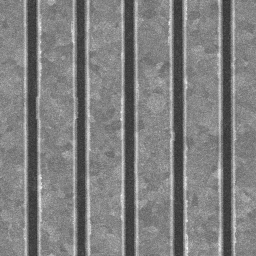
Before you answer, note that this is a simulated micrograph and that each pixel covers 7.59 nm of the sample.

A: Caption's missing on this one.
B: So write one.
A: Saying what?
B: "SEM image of parallel lines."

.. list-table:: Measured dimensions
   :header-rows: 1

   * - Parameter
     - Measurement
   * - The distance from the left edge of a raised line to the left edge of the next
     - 48.6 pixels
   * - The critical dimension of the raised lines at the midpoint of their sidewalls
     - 265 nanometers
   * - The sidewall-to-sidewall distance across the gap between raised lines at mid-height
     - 101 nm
